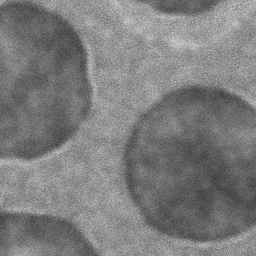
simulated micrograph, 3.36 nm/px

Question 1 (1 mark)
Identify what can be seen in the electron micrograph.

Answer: holes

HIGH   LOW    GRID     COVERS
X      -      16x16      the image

---XXXXXX----XXX
----XXXXXXXXXXXX
-----XXXXXXXXXXX
-----XXXXXXXXXXX
------XXXXXXXXXX
------XXXXX---XX
------XXXX------
-----XXXX-------
-----XXX--------
---XXXXX--------
XXXXXXXX--------
XXXXXXXX--------
XXXXXXXX--------
---XXXXXX-------
-----XXXXX-----X
------XXXXXXXXXX